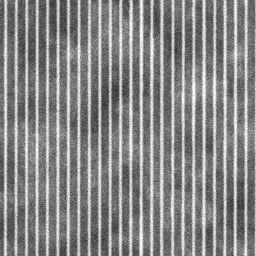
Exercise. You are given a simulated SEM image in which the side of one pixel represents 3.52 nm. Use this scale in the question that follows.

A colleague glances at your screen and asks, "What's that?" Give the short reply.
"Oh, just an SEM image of parallel lines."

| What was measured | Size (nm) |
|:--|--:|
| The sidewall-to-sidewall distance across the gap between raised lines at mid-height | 30.8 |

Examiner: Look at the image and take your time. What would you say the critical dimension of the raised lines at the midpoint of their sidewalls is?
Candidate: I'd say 1.76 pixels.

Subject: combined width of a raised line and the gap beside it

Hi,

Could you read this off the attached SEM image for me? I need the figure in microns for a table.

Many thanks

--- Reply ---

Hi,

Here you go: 0.0369